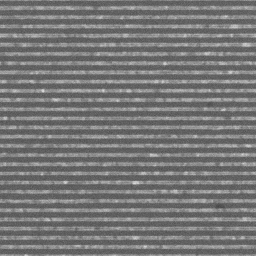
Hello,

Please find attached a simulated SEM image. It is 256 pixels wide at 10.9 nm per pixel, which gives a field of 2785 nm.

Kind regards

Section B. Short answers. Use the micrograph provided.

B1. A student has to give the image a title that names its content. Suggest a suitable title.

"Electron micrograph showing parallel lines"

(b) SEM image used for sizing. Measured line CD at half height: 0.0231 um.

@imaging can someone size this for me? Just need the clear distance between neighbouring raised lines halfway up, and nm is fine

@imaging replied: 76.2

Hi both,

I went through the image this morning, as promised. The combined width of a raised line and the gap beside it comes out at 100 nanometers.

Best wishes